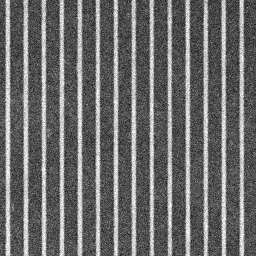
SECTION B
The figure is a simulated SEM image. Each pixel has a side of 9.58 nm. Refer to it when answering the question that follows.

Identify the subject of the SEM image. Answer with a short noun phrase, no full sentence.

parallel lines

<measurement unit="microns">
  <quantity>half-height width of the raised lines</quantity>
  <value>0.0156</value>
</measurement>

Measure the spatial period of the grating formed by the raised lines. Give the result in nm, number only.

172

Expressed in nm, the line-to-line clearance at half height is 157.